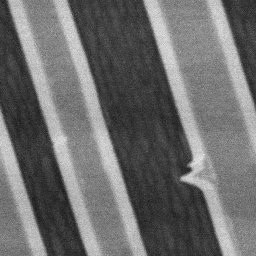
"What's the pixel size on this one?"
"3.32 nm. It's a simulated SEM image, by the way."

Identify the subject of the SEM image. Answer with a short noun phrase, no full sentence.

one or a few lines or trenches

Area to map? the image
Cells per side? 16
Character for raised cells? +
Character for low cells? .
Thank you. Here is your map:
.+++......++++..
.+++......++++..
..+++.....++++..
..+++......+++..
..+++......++++.
...+++.....++++.
...+++.....++++.
...+++......++++
....++......++++
....+++.....++++
+...+++.....++++
+...+++......+++
+....+++.....+++
++...+++......++
++...+++......++
++....+++.....++